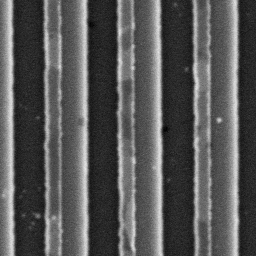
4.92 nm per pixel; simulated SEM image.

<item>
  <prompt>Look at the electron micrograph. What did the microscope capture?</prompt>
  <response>lines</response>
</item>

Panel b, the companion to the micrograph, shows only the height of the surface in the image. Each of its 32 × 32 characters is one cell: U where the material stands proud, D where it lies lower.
UDDDDDUUUUUDDDDUUUUUDDDDUUUUUDDD
UDDDDDUUUUUDDDDUUUUUDDDDUUUUUDDD
UDDDDDUUUUUDDDDUUUUUDDDDUUUUUDDD
UDDDDDUUUUUDDDDUUUUUDDDDUUUUUDDD
UDDDDDUUUUUDDDDUUUUUDDDDUUUUUDDD
UDDDDDUUUUUDDDDUUUUUDDDDUUUUUDDD
UDDDDDUUUUUDDDDUUUUUDDDDUUUUUDDD
UDDDDDUUUUUDDDDUUUUUDDDDUUUUUDDD
UDDDDDUUUUUDDDDUUUUUDDDDUUUUUDDD
UDDDDDUUUUUDDDDUUUUUDDDDUUUUUDDD
UDDDDDUUUUUDDDDUUUUUDDDDDUUUUDDD
UDDDDDUUUUUDDDDUUUUUDDDDDUUUUDDD
UDDDDDUUUUUDDDDUUUUUDDDDUUUUUDDD
UDDDDDUUUUUDDDDUUUUUDDDDUUUUUDDD
UDDDDDUUUUUDDDDUUUUUDDDDDUUUUDDD
UDDDDDUUUUUDDDDUUUUUDDDDDUUUUDDD
UDDDDDUUUUUDDDDUUUUUDDDDDUUUUDDD
UDDDDDUUUUUDDDDUUUUUDDDDUUUUUDDD
UDDDDDUUUUUDDDDUUUUUDDDDDUUUUDDD
UDDDDDUUUUUDDDDUUUUUDDDDDUUUUDDD
UDDDDDUUUUUDDDDUUUUUDDDDDUUUUDDD
UUDDDDUUUUUDDDDUUUUUDDDDDUUUUDDD
UDDDDDUUUUUDDDDUUUUUDDDDDUUUUDDD
UUDDDDUUUUUDDDDUUUUUDDDDDUUUUDDD
UUDDDDUUUUUDDDDUUUUUDDDDDUUUUDDD
UDDDDDUUUUUDDDDUUUUUDDDDDUUUUDDD
UUDDDDUUUUUDDDDUUUUUDDDDDUUUUDDD
UUDDDDUUUUUDDDDUUUUUDDDDDUUUUUDD
UUDDDDUUUUUDDDDUUUUUDDDDDUUUUDDD
UUDDDDUUUUUDDDDUUUUUDDDDDUUUUDDD
UUDDDDUUUUUDDDDUUUUUDDDDDUUUUDDD
UUDDDDUUUUUDDDDUUUUUDDDDDUUUUDDD